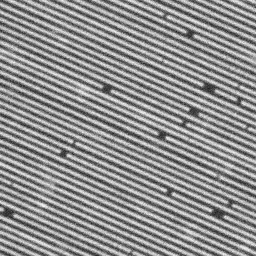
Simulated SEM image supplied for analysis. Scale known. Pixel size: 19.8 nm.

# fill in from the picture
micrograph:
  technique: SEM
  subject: parallel lines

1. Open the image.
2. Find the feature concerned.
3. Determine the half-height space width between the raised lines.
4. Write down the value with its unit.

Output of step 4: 92.8 nanometers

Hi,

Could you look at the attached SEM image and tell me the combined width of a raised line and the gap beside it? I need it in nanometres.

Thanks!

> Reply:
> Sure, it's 138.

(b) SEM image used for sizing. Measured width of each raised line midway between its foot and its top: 40.7 nm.